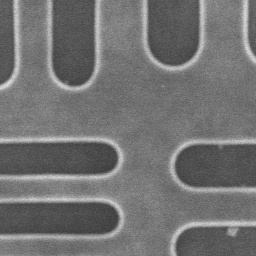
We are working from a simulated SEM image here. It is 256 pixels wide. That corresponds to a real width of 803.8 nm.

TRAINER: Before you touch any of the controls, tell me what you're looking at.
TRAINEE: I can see groups of lines, slits or small figures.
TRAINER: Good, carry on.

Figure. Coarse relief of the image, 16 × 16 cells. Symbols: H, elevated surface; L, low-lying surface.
LHHLLLHHHLLLLHHL
LHHLLLHHHLLLLHHL
LHHLLLHHHLLLHHHL
LHHLLLHHHHLLHHHH
LHHLLLHHHHHHHHHH
HHHHHHHHHHHHHHHH
HHHHHHHHHHHHHHHH
HHHHHHHHHHHHHHHH
HHHHHHHHHHHHHHHH
LLLLLLLHHHHLLLLL
LLLLLLLHHHHLLLLL
HHHHHHHHHHHLLLLL
HHHHHHHHHHHHHHHH
LLLLLLLHHHHHHHHH
LLLLLLLHHHHLLLLL
HHHHHHHHHHHLLLLL